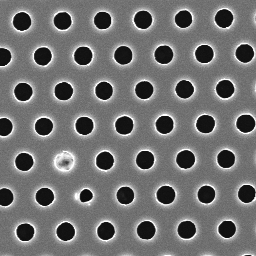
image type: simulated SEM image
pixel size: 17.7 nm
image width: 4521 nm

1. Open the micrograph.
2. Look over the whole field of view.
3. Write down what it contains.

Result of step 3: a regular array of holes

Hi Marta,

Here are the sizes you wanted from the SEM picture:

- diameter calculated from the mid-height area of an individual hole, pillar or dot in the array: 323 nanometers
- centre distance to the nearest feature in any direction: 710 nm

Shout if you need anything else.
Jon